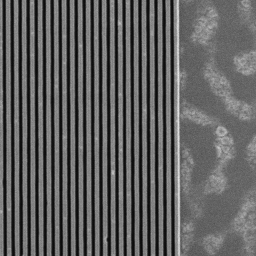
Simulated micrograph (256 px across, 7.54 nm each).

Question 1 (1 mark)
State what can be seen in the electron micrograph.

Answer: parallel lines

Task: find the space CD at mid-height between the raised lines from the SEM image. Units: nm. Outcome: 26.4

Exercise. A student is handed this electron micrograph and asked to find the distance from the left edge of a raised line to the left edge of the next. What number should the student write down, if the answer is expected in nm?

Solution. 60.3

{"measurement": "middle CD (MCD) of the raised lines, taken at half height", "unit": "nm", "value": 33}